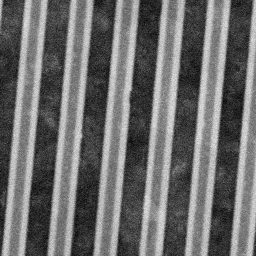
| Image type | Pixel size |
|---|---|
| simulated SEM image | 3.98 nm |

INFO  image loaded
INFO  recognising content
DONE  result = parallel lines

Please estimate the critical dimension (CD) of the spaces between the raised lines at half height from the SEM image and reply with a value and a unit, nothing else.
118 nanometres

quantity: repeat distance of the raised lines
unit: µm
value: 0.181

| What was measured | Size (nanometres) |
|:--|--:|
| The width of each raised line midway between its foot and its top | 64.3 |